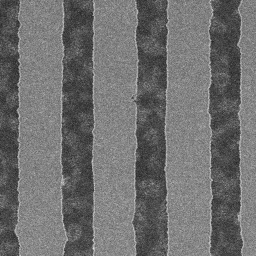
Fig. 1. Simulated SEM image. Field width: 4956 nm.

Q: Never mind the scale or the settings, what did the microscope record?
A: one or a few lines or trenches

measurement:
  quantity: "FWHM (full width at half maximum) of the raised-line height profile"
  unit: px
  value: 42.6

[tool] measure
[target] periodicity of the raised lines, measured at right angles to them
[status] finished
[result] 1430 nanometers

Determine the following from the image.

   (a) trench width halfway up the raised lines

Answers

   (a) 601 nm